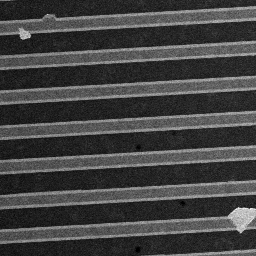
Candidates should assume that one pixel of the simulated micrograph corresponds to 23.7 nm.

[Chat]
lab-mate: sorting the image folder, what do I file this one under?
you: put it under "parallel lines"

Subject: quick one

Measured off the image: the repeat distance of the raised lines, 819 nanometres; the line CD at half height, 0.263 µm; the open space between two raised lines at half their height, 546 nm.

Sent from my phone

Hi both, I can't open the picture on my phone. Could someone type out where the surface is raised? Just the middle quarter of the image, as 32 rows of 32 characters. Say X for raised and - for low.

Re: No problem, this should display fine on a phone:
--------------------------------
--------------------------------
--------------------------------
--------------------------------
--------------------------XXXXXX
---------XXXXXXXXXXXXXXXXXXXXXXX
XXXXXXXXXXXXXXXXXXXXXXXXXXXXXXXX
XXXXXXXXXXXXXXXXXXXXXXX---------
XXXXX---------------------------
--------------------------------
--------------------------------
--------------------------------
--------------------------------
----------------------XXXXXXXXXX
-----XXXXXXXXXXXXXXXXXXXXXXXXXXX
XXXXXXXXXXXXXXXXXXXXXXXXXXXXXXXX
XXXXXXXXXXXXXXXXXXX-------------
XX------------------------------
--------------------------------
--------------------------------
--------------------------------
--------------------------------
-------------------XXXXXXXXXXXXX
--XXXXXXXXXXXXXXXXXXXXXXXXXXXXXX
XXXXXXXXXXXXXXXXXXXXXXXXXXXXXXXX
XXXXXXXXXXXXXXX-----------------
--------------------------------
--------------------------------
--------------------------------
--------------------------------
-----------------------------XXX
------------XXXXXXXXXXXXXXXXXXXX